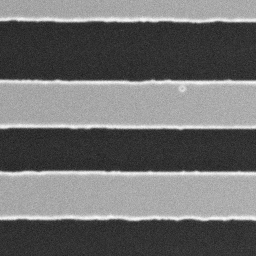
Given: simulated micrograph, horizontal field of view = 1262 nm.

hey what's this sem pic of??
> lines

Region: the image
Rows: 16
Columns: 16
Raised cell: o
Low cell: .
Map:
oooooooooooooooo
................
................
................
................
oooooooooooooooo
oooooooooooooooo
oooooooooooooooo
................
................
................
oooooooooooooooo
oooooooooooooooo
oooooooooooooooo
................
................